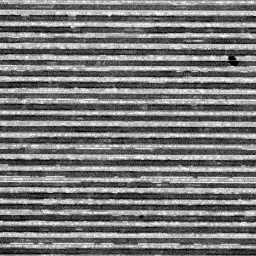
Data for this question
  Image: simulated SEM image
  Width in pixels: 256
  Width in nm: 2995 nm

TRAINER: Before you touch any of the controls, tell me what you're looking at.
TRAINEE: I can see parallel lines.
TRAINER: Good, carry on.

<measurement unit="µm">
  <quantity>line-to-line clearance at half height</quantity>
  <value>0.0716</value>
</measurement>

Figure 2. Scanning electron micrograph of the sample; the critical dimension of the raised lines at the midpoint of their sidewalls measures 61.4 nm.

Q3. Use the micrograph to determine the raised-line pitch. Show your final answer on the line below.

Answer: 11.1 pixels